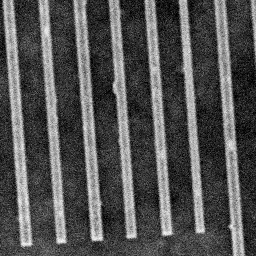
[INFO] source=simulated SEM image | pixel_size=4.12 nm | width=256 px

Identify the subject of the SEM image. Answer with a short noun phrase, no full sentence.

parallel lines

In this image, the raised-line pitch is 145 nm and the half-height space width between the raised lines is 106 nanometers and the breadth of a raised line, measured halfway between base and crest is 40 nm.